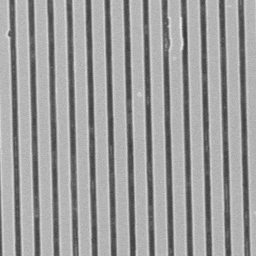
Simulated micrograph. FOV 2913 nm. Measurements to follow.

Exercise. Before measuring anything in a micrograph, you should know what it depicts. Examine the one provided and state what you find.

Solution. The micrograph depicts parallel lines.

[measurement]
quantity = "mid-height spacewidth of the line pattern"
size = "66.8 nm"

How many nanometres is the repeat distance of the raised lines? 217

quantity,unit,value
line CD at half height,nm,144